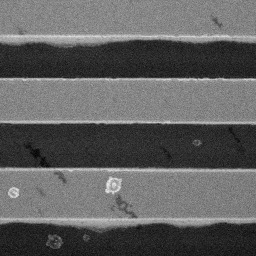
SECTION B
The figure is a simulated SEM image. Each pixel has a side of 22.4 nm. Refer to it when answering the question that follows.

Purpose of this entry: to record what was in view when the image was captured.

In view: lines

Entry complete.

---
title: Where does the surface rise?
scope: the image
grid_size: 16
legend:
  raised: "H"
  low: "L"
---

HHHHHHHHHHHHHHHH
HHHHHHHHHHHHHHHH
LLLLLLLLLLLLLLLL
LLLLLLLLLLLLLLLL
LLLLLLLLLLLLLLLL
HHHHHHHHHHHHHHHH
HHHHHHHHHHHHHHHH
HHHHHHHHHHHHHHHH
LLLLLLLLLLLLLLLL
LLLLLLLLLLLLLLLL
LLLLLLLLLLLLLLLL
HHHHHHHHHHHHHHHH
HHHHHHHHHHHHHHHH
HHHHHHHHHHHHHHHH
LLLLLLLLLLLLLLLL
LLLLLLLLLLLLLLLL